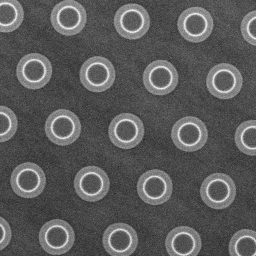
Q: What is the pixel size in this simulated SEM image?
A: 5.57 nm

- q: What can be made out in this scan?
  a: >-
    an array of small figures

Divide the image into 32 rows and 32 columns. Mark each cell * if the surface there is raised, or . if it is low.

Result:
**.....***......*...............
***...*****....***.....***.....*
***...*****...*****...*****...**
**.....***....*****...*****...**
...............***.....***....**
...............................*
................................
...***.....***..................
..****....****....****.....***..
..****....****....****....****..
...***....****....****....****..
...................**.....****..
................................
*...............................
**....****.....**...............
**....****....****....***.....**
**....****....****...*****...***
*.....***.....****....****...***
...............*......***.....**
................................
...*............................
..***.....***.....**............
.*****...*****...****.....***...
..***....*****...****....****...
..***.....***....****....****...
...................*......***...
................................
*......*........................
*....****....****.....**........
*....****....****....****....***
*....****....****....****....***
......**.....****....****....***